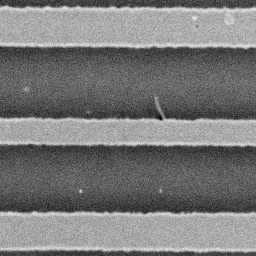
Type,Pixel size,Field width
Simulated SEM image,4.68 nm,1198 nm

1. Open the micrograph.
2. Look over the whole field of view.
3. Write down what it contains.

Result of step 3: lines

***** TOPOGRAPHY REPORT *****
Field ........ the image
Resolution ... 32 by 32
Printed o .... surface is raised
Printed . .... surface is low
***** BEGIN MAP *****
................................
oooooooooooooooooooooooooooooooo
oooooooooooooooooooooooooooooooo
oooooooooooooooooooooooooooooooo
oooooooooooooooooooooooooooooooo
oooooooooooooooooooooooooooooooo
................................
................................
................................
................................
................................
................................
................................
................................
................................
oooooooooooooooooooooooooooooooo
oooooooooooooooooooooooooooooooo
oooooooooooooooooooooooooooooooo
................................
................................
................................
................................
................................
................................
................................
................................
................................
oooooooooooooooooooooooooooooooo
oooooooooooooooooooooooooooooooo
oooooooooooooooooooooooooooooooo
oooooooooooooooooooooooooooooooo
................................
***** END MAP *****